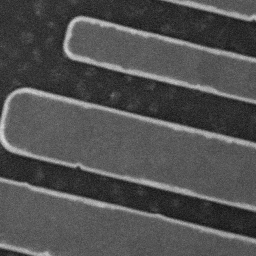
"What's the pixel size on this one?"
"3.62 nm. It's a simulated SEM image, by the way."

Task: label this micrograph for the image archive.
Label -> one or a few lines or trenches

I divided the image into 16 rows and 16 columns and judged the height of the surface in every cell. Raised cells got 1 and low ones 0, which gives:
0000000000000111
0000011000000000
0000111111100000
0000111111111110
0000000011111111
0000000000001111
1111100000000000
1111111111000000
1111111111111100
0111111111111111
0000011111111111
1000000001111111
1111100000000111
1111111111000000
1111111111111100
1111111111111111